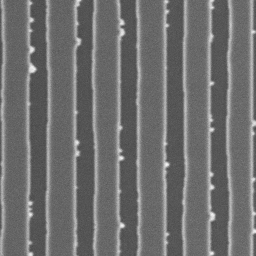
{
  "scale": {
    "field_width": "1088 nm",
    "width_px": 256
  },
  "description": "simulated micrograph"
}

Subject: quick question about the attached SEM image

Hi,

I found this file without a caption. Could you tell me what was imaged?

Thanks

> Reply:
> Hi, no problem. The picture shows lines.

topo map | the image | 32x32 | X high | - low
XXXX--XXXX--XXX--XXXX--XXX---XXX
XXXX--XXXX--XXX--XXXX--XXX---XXX
XXXX--XXXX--XXX--XXXX--XXX---XXX
XXXX--XXXX--XXX--XXXX--XXX---XXX
XXXX--XXXX--XXX--XXXX--XXX---XXX
XXXX--XXXX--XXX--XXXX--XXX---XXX
XXXX--XXXX--XXX--XXXX--XXX---XXX
XXXX--XXX---XXX--XXXX--XXX---XXX
XXXX--XXXX--XXX--XXXX--XXX---XXX
XXXX--XXX---XXX--XXXX--XXX---XXX
XXXX--XXX---XXX--XXXX--XXX---XXX
XXXX--XXX---XXX--XXXX--XXX---XXX
XXXX--XXX---XXX--XXXX--XXX---XXX
XXXX--XXX---XXX--XXXX--XXX---XXX
XXXX--XXX---XXX--XXXX--XXX--XXXX
XXXX--XXX---XXX--XXXX--XXX--XXXX
XXXX--XXX---XXX--XXXX--XXX--XXXX
XXXX--XXXX--XXX--XXXX--XXX--XXXX
XXXX--XXXX--XXX--XXXX--XXX--XXXX
XXXX--XXXX--XXX--XXXX--XXX--XXXX
XXXX--XXX---XXX--XXXX--XXX---XXX
XXXX--XXX---XXX--XXXX--XXX---XXX
XXXX--XXX---XXX--XXXX--XXX---XXX
XXXX--XXX---XXX--XXXX--XXX---XXX
XXXX--XXX---XXX--XXXX--XXX---XXX
XXXX--XXX---XXX--XXXX--XXX---XXX
XXXX--XXX---XXX--XXXX--XXX---XXX
XXXX--XXXX--XXX--XXXX--XXX---XXX
XXXX--XXXX--XXX--XXXX--XXX---XXX
XXXX--XXXX--XXX--XXXX--XXX---XXX
XXXX--XXXX--XXX--XXXX--XXX---XXX
XXXX--XXX---XXX--XXXX--XXX---XXX